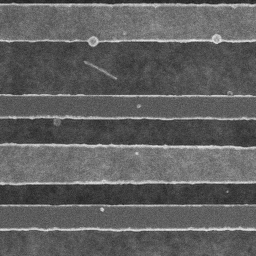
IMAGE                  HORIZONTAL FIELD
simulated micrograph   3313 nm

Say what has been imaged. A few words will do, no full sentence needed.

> lines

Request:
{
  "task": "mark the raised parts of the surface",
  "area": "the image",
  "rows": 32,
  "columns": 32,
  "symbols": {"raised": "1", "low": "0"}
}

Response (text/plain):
01000000000000000000000000000000
11111111111111111111111111111111
11111111111111111111111111111111
11111111111111111111111111111111
11111111111111111111111111111111
00000000000100000000000000000000
00000000000000000000000000000000
00000000000000000000000000000000
00000000000000000000000000000000
00000000000000000000000000000000
00000000000000000000000000000000
00000000000000000000000000000000
11111111111111111111111111111111
11111111111111111111111111111111
11111111111111111111111111111111
00000000000000000000000000000000
00000000000000000000000000000000
00000000000000000000000000000000
11111111111111111111111111111111
11111111111111111111111111111111
11111111111111111111111111111111
11111111111111111111111111111111
11111111111111111111111111111111
00000000000000000000000000000000
00000000000000000000000000000000
00000000000000000000000000000000
11111111111111111111111111111111
11111111111111111111111111111111
11111111111111111111111111111111
00000000000000000000000000000000
00000000000000000000000000000000
00000000000000000000000000000000